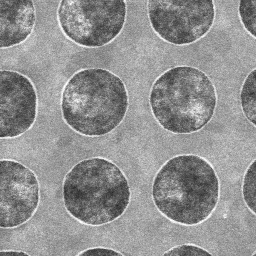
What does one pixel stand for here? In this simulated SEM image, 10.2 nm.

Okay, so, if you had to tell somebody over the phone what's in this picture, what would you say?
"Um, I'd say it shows holes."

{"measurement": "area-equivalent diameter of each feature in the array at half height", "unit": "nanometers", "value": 688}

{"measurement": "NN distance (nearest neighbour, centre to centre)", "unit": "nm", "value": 914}